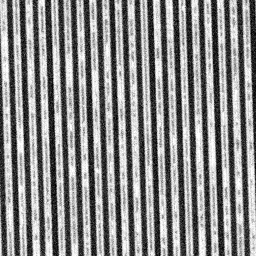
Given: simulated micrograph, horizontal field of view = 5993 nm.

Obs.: parallel lines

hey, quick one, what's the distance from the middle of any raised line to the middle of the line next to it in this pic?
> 0.299 µm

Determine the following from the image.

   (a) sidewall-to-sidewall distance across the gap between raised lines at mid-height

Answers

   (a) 155 nm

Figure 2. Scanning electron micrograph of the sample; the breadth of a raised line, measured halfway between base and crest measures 0.132 um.